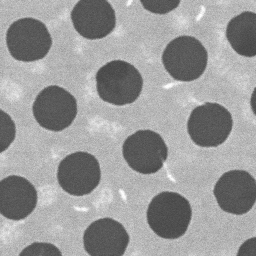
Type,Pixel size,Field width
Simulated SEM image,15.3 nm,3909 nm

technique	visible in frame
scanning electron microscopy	a regular array of holes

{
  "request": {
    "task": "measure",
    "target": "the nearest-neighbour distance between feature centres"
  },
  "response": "1060 nm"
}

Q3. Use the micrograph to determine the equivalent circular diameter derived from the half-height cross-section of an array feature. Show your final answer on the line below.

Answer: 699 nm